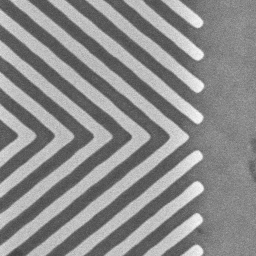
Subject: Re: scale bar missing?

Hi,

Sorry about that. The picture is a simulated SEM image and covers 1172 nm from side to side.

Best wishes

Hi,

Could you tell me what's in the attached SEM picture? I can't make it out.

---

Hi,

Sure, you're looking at groups of lines, slits or small figures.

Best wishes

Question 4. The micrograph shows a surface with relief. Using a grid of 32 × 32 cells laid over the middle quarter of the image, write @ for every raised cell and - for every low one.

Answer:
@-----@@@@------@@@@-----@@@@---
@@-----@@@@@-----@@@@-----@@@@--
@@@@----@@@@@-----@@@@@-----@@@@
@@@@------@@@@-----@@@@@-----@@@
-@@@@@-----@@@@-----@@@@@-----@@
---@@@@-----@@@@------@@@@-----@
----@@@@-----@@@@@-----@@@@-----
-----@@@@-----@@@@@-----@@@@----
@-----@@@@@-----@@@@-----@@@@---
@@-----@@@@@-----@@@@-----@@@@@-
@@@-----@@@@@-----@@@@-----@@@@@
@@@@@-----@@@@-----@@@@@-----@@@
-@@@@@-----@@@@-----@@@@------@@
---@@@@-----@@@@-----@@@@@-----@
----@@@@-----@@@@@-----@@@@-----
-----@@@@-----@@@@@-----@@@@----
@-----@@@@-----@@@@@-----@@@@---
@@-----@@@@@-----@@@@-----@@@@@-
@@-----@@@@@-----@@@@-----@@@@@-
@-----@@@@@-----@@@@------@@@@--
-----@@@@@-----@@@@------@@@@---
----@@@@------@@@@-----@@@@@----
---@@@@-----@@@@@-----@@@@------
--@@@@-----@@@@@-----@@@@-----@@
-@@@@-----@@@@@-----@@@@-----@@@
@@@-----@@@@@-----@@@@@-----@@@@
@@-----@@@@@-----@@@@@-----@@@@-
@-----@@@@@-----@@@@@-----@@@@--
-----@@@@------@@@@-----@@@@@---
----@@@@-----@@@@@-----@@@@-----
---@@@@-----@@@@@-----@@@@------
-@@@@@-----@@@@------@@@@-----@@